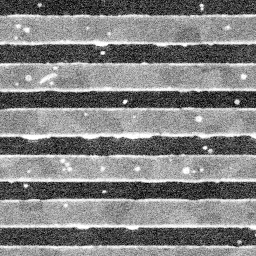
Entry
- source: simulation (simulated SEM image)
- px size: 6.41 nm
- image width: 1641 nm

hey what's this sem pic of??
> lines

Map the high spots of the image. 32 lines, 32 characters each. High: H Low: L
LLLLLLLLLLLLLLLLLLLLLLLLLLLLLLLL
LLLLLLLLLLLLLLLLLLLLLLLLLLLLLLLL
HHHHHHHHHHHHHHHHHHHHHHHHHHHHHHHH
HHHHHHHHHHHHHHHHHHHHHHHHHHHHHHHH
HHHHHHHHHHHHHHHHHHHHHHHHHHHHHHHH
LHHHHLLLLLLLLLLLLLLHHHHHHLHLLLLL
LLLLLLLLLLLLLLLLLLLLLLLLLLLLLLLL
LLLLLLLLLLLLLLLLLLLLLLLLLLLLLLLL
HHHHHHHHHHHHHHHHHHHHHHHHHHHHHHHH
HHHHHHHHHHHHHHHHHHHHHHHHHHHHHHHH
HHHHHHHHHHHHHHHHHHHHHHHHHHHHHHHH
LLLLLLLLLLLLLLLLLLLLLLLLLLLLLLLL
LLLLLLLLLLLLLLLLLLLLLLLLLLLLLLLL
LLLLLLLLLLLLLLLLLLLLLLLLLLLLLLLL
HHHHHHHHHHHHHHHHHHHHHHHHHHHHHHHH
HHHHHHHHHHHHHHHHHHHHHHHHHHHHHHHH
HHHHHHHHHHHHHHHHHHHHHHHHHHHHHHHH
LLLLLLLLLLLLLLLLLLLLLLLLLLLLLLLL
LLLLLLLLLLLLLLLLLLLLLLLLLLLLLLLL
HHHHHHHHHHHHHHHHHHHHHHHHHHHHHHHH
HHHHHHHHHHHHHHHHHHHHHHHHHHHHHHHH
HHHHHHHHHHHHHHHHHHHHHHHHHHHHHHHH
HHHHHHHHHHHHHHHHHHHHHHHHHHHHHHHH
LLLLLLLLLLLLLLLLLLLLLLLLLLLLLLLL
LLLLLLLLLLLLLLLLLLLLLLLLLLLLLLLL
HHHHHHHHHHHHHHHHHHHHHHHHHHHHHHHH
HHHHHHHHHHHHHHHHHHHHHHHHHHHHHHHH
HHHHHHHHHHHHHHHHHHHHHHHHHHHHHHHH
LLLLLLLLLLLLLLLLLLLLLLLLLLLLLLLL
LLLLLLLLLLLLLLLLLLLLLLLLLLLLLLLL
LLLLLLLLLLLLLLLLLLLLLLLLLLLLLLLL
HHHHHHHHHHHHHHHHHHHHHHHHHHHHHHHH